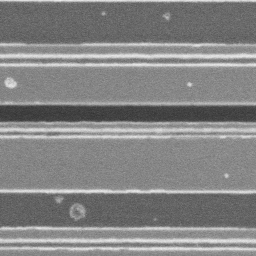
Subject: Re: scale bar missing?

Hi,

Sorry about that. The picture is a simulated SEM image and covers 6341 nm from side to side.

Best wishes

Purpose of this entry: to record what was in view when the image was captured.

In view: lines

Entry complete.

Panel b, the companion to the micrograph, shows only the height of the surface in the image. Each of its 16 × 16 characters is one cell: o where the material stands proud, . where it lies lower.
................
................
................
oooooooooooooooo
oooooooooooooooo
oooooooooooooooo
................
................
oooooooooooooooo
oooooooooooooooo
oooooooooooooooo
oooooooooooooooo
................
................
oooooooooooooooo
oooooooooooooooo